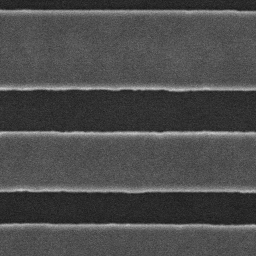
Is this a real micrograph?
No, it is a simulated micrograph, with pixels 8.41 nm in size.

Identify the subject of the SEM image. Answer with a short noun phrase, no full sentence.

lines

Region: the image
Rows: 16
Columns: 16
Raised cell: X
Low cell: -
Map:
----------------
XXXXXXXXXXXXXXXX
XXXXXXXXXXXXXXXX
XXXXXXXXXXXXXXXX
XXXXXXXXXXXXXXXX
XXXXXXXXXXXXXXXX
----------------
----------------
XXXXXXXXXXXXXXXX
XXXXXXXXXXXXXXXX
XXXXXXXXXXXXXXXX
XXXXXXXXXXXXXXXX
----------------
----------------
XXXXXXXXXXXXXXXX
XXXXXXXXXXXXXXXX